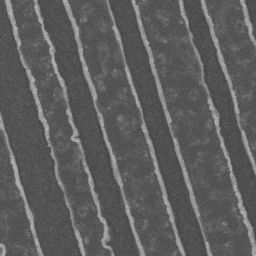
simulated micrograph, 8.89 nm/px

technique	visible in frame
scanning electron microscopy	one or a few lines or trenches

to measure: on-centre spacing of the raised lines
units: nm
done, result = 573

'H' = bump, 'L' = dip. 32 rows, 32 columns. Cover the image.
LHHHHLLLHHHHHHLLLHHHHHHLLHHHHHHL
LHHHHLLLHHHHHHLLLHHHHHHLLLHHHHHL
LHHHHLLLLHHHHHLLLHHHHHHLLLHHHHHL
LLHHHHLLLHHHHHHLLHHHHHHHLLHHHHHL
LLHHHHLLLHHHHHHLLLHHHHHHLLLHHHHL
LLHHHHLLLLHHHHHLLLHHHHHHLLLHHHHH
LLHHHHHLLLHHHHHLLLLHHHHHHLLHHHHH
LLLHHHHLLLHHHHHHLLLHHHHHHLLLHHHH
LLLHHHHLLLHHHHHHLLLHHHHHHLLLHHHH
LLLLHHHHLLLHHHHHLLLHHHHHHLLLHHHH
LLLLHHHHLLLHHHHHHLLLHHHHHHLLLHHH
LLLLHHHHLLLLHHHHHLLLHHHHHHLLLHHH
LLLLHHHHLLLLHHHHHLLLHHHHHHLLLHHH
LLLLLHHHHLLLHHHHHHLLHHHHHHHLLHHH
LLLLLHHHHLLLHHHHHHLLLHHHHHHLLLHH
LLLLLHHHHLLLLHHHHHLLLHHHHHHLLLHH
HLLLLLHHHHLLLHHHHHLLLHHHHHHLLLHH
HLLLLLHHHHLLLHHHHHHLLLHHHHHHLLHH
HLLLLLHHHHLLLLHHHHHLLLHHHHHHLLLH
HHLLLLLHHHHLLLHHHHHLLLHHHHHHHLLH
HHLLLLLHHHHLLLHHHHHHLLLHHHHHHLLL
HHLLLLLHHHHLLLHHHHHHLLLHHHHHHLLL
HHLLLLLHHHHLLLLHHHHHLLLHHHHHHLLL
HHHLLLLLHHHHLLLHHHHHHLLHHHHHHHLL
HHHLLLLLHHHHLLLHHHHHHLLLHHHHHHLL
HHHLLLLLHHHHLLLLHHHHHLLLHHHHHHLL
HHHHLLLLLHHHHLLLHHHHHLLLLHHHHHHL
HHHHLLLLLHHHHLLLHHHHHHLLLHHHHHHL
HHHHLLLLLHHHHLLLHHHHHHLLLHHHHHHL
HHHHLLLLLLHHHLLLLHHHHHLLLHHHHHHH
HHHHHLLLLLHHHLLLLHHHHHHLLLHHHHHH
HHHHHLLLLLHHHHLLLLHHHHHLLLHHHHHH